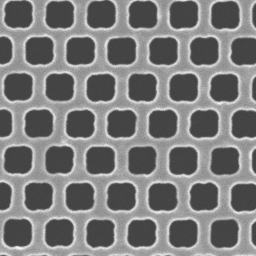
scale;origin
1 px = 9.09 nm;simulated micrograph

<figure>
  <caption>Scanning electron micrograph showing a regular array of holes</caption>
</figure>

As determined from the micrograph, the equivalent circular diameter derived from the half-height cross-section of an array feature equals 0.28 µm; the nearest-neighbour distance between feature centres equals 374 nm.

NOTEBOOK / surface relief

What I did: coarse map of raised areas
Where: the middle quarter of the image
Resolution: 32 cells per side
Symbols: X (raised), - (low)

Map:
XXXXXXXXXXXXXXXXXXXXXXXXXXXXXXXX
XXXXXXXXXXXXXXXXXXXXXXXXXXXXXXXX
-XXXXXX----XXXXXXX----XXXXXX----
--XXXX-------XXX-------XXXX-----
---XXX-------XXX-------XXX------
---XX--------XXX-------XXX------
---XX--------XXX-------XXX------
---XX--------XXX-------XXX------
--XXXX------XXXX-------XXXX-----
XXXXXXX-XXXXXXXXXXXXXXXXXXXXXXXX
XXXXXXXXXXXXXXXXXXXXXXXXXXXXXXXX
XXX---XXXXXXX-X--XXXXXX----XXXXX
X------XXXX-------XXX-------XXXX
X-------XXX-------XXX-------XXXX
X-------XXX-------XXX-------XXX-
--------XXX-------XXX-------XXX-
--------XXX-------XXX-------XXX-
X------XXXX-------XXX-------XXXX
XXXX--XXXXXX----XXXXXX----XXXXXX
XXXXXXXXXXXXXXXXXXXXXXXXXXXXXXXX
-XXXXXX----XXXXXXXXXXXXXXXXXXXXX
--XXXX------XXXX-------XXXX-----
---XX--------XXX-------XXX------
---XX--------XXX-------XXX------
---XX--------XXX-------XXX------
--XXX--------XXX-------XXX------
--XXXX------XXXX-------XXX------
-XXXXXX----XXXXXX----XXXXXX-----
XXXXXXXXXXXXXXXXXXXXXXXXXXXXXXXX
XXXXXXXXXXXXXXX-XXXXXXXXXXXXXXXX
X------XXXX-------XXXX------XXXX
--------XXX-------XXX-------XXX-